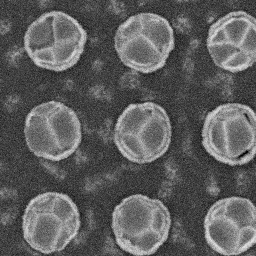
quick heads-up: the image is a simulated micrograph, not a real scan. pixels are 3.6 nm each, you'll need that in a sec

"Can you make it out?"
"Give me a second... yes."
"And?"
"raised bodies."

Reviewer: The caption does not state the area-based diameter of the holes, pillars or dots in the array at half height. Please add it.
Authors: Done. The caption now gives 54.4 pixels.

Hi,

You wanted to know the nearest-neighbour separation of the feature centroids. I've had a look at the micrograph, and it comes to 88.8 px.